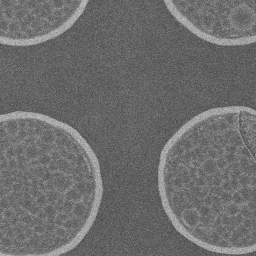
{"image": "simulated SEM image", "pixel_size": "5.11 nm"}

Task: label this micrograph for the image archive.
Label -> raised bodies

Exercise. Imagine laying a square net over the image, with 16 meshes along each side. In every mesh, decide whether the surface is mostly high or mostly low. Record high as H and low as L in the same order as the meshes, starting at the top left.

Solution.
HHHHHLLLLLLHHHHH
HHHHLLLLLLLLHHHH
HHLLLLLLLLLLLHHH
LLLLLLLLLLLLLLLL
LLLLLLLLLLLLLLLL
LLLLLLLLLLLLLLLL
LLLLLLLLLLLLLLLL
HHHLLLLLLLLLHHHH
HHHHHLLLLLLHHHHH
HHHHHHLLLLHHHHHH
HHHHHHLLLLHHHHHH
HHHHHHLLLLHHHHHH
HHHHHHLLLLHHHHHH
HHHHHHLLLLLHHHHH
HHHHHLLLLLLLHHHH
HHHHLLLLLLLLLHHH